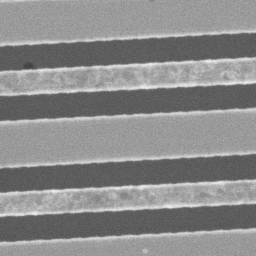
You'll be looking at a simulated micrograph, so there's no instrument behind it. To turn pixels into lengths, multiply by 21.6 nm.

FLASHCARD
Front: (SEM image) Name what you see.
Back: lines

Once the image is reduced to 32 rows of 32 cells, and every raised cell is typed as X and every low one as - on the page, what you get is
XXXXXXXXXXXXXXXXXXXXXXXXXXXXXXXX
XXXXXXXXXXXXXXXXXXXXXXXXXXXXXXXX
XXXXXXXXXXXXXXXXXXXXXXXXXXXXXXXX
XXXXXXXXXXXXXXXXXXXXXXXXXXXXXXXX
XXXXXXXXXXXXXXXXXXXX------------
XX------------------------------
--------------------------------
----------------------------XXXX
---------XXXXXXXXXXXXXXXXXXXXXXX
XXXXXXXXXXXXXXXXXXXXXXXXXXXXXXXX
XXXXXXXXXXXXXXXXXXXXXXXXXXXXX---
XXXXXXXXX-----------------------
--------------------------------
--------------------------------
---------------XXXXXXXXXXXXXXXXX
XXXXXXXXXXXXXXXXXXXXXXXXXXXXXXXX
XXXXXXXXXXXXXXXXXXXXXXXXXXXXXXXX
XXXXXXXXXXXXXXXXXXXXXXXXXXXXXXXX
XXXXXXXXXXXXXXXXXXXXXXXXXXXXXXXX
XXXXXXXXXXXXXXXXXXXXXXXXXXX-----
XXXXXXX-------------------------
--------------------------------
--------------------------------
-------------XXXXXXXXXXXXXXXXXXX
XXXXXXXXXXXXXXXXXXXXXXXXXXXXXXXX
XXXXXXXXXXXXXXXXXXXXXXXXXXXXX---
XXXXXXXXXX----------------------
--------------------------------
--------------------------------
----------------XXXXXXXXXXXXXXXX
XXXXXXXXXXXXXXXXXXXXXXXXXXXXXXXX
XXXXXXXXXXXXXXXXXXXXXXXXXXXXXXXX